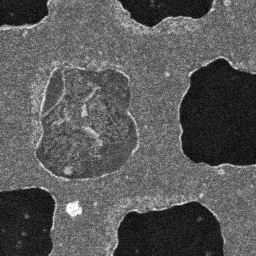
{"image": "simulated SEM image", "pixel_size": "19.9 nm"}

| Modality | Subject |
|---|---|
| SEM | holes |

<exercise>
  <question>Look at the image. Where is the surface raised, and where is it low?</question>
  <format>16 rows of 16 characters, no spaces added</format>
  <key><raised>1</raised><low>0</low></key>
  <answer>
0001111100000111
0011111110111111
1111111111111111
1111111111111111
1111111111110001
1111111111110000
1111100111100000
1111100011100000
1111110011100000
1110111111100000
1111111111111111
1111111111111111
0001111111111111
0001111100000111
0001111000000011
0001111000000011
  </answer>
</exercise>